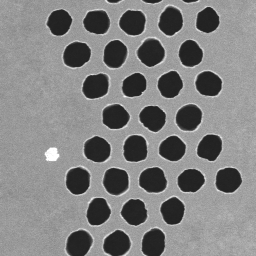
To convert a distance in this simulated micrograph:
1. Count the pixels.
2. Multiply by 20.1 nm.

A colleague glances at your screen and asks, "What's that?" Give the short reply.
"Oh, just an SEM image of a regular array of holes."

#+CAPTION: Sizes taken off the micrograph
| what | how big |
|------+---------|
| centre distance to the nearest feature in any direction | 35.9 px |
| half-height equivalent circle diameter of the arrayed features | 514 nanometres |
